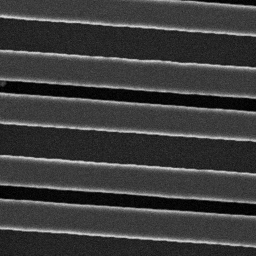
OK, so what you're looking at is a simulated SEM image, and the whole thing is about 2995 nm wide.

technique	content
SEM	lines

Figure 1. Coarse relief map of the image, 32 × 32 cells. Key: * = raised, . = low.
****************************....
********************************
.....***************************
...................*************
................................
................................
****............................
******************..............
*******************************.
********************************
.......*************************
.....................***********
************....................
*************************.......
********************************
..******************************
.................***************
.............................***
................................
**..............................
**************..................
*****************************...
********************************
......**************************
....................************
********........................
************************........
********************************
********************************
.............*******************
...........................*****
................................